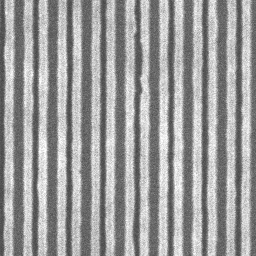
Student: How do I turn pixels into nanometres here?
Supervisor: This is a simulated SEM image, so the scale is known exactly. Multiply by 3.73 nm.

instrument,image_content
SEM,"parallel lines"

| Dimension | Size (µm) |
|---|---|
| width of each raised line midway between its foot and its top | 0.0327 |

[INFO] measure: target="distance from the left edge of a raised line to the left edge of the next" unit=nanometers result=63.2